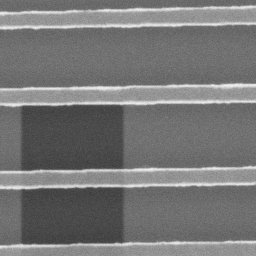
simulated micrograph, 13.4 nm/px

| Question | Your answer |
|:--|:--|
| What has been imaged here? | lines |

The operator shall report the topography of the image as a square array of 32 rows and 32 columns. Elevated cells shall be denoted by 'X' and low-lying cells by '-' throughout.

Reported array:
--------------------------------
--------XXXXXXXXXXXXXXXXXXXXXXXX
XXXXXXXXXXXXXXXXXXXXXXXXXXXXXXXX
X-------------------------------
--------------------------------
--------------------------------
--------------------------------
--------------------------------
--------------------------------
--------------------------------
--------------------------------
XXXXXXXXXXXXXXXXXXXXXXXXXXXXXXXX
XXXXXXXXXXXXXXXXXXXXXXXXXXXXXXXX
--------------------------------
--------------------------------
--------------------------------
--------------------------------
--------------------------------
--------------------------------
--------------------------------
--------------------------------
XXXXXXXXXXXXXXXXXXXXXXXXXXXXXXXX
XXXXXXXXXXXXXXXXXXXXXXXXXXXXXXXX
XXXXX---------------------------
--------------------------------
--------------------------------
--------------------------------
--------------------------------
--------------------------------
--------------------------------
----------------XXXXXXXXXXXXXXXX
XXXXXXXXXXXXXXXXXXXXXXXXXXXXXXXX